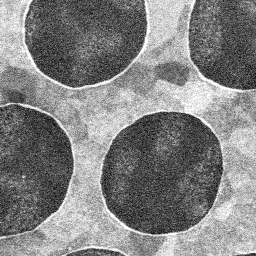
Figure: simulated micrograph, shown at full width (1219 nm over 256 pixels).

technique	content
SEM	holes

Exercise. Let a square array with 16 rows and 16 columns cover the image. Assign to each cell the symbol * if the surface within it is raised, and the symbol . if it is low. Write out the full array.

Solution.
**.......***....
**.......***....
**.......***....
**.......***....
***.....****....
**************..
****************
...******....***
....***.......**
.....**.......**
.....*........**
....**........**
....**.......***
...****......***
..*******..*****
****************